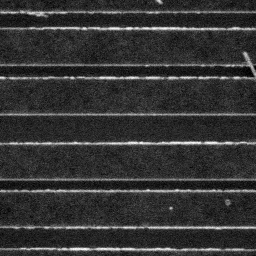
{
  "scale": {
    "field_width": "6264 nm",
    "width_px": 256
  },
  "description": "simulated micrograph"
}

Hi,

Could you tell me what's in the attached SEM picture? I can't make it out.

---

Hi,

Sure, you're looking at lines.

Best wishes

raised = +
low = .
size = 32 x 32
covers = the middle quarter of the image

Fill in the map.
................................
................................
................................
................................
++++++++++++++++++++++++++++++++
++++++++++++++++++++++++++++++++
++++++++++++++++++++++++++++++++
++++++++++++++++++++++++++++++++
++++++++++++++++++++++++++++++++
++++++++++++++++++++++++++++++++
++++++++++++++++++++++++++++++++
++++++++++++++++++++++++++++++++
++++++++++++++++++++++++++++++++
................................
................................
................................
................................
................................
................................
................................
++++++++++++++++++++++++++++++++
++++++++++++++++++++++++++++++++
++++++++++++++++++++++++++++++++
++++++++++++++++++++++++++++++++
++++++++++++++++++++++++++++++++
++++++++++++++++++++++++++++++++
++++++++++++++++++++++++++++++++
++++++++++++++++++++++++++++++++
++++++++++++++++++++++++++++++++
................................
................................
................................